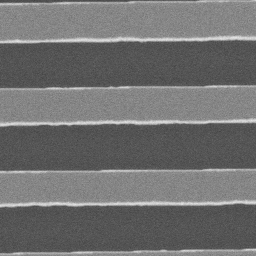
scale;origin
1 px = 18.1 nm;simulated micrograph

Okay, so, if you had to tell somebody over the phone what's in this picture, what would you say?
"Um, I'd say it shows lines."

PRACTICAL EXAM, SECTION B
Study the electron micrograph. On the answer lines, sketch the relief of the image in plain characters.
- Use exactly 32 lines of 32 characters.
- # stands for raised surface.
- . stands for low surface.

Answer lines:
################################
################################
################################
################################
################################
................................
................................
................................
................................
................................
................................
################################
################################
################################
################################
############....................
................................
................................
................................
................................
................................
################################
################################
################################
################################
###################..#####......
................................
................................
................................
................................
................................
................################